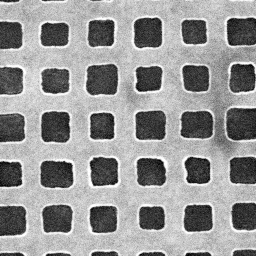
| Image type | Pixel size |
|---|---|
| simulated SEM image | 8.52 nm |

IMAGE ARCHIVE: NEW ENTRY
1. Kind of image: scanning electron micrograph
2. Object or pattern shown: a regular array of holes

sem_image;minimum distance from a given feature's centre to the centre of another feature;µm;0.391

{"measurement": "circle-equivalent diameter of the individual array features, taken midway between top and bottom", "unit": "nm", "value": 266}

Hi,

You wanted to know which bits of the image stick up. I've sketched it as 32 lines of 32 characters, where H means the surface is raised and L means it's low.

HHHHHHHHHHHHHHHHHHHHHHHHHHHHHHHH
HHHHHHHHHHHHHHHHHHHHHHHHHHHHHHHH
HHHHHHHHHHHHLLHHHLLLHHHLLHHHLLLL
LLLHHLLLLHHLLLHHHLLLHHHLLLHHLLLL
LLLHHLLLLHHLLLHHHLLLHHHLLLHHLLLL
LLLHHLLLHHHLLLHHHLLLHHHLLHHHHLLL
HHHHHHHHHHHHHHHHHHHHHHHHHHHHHHHH
HHHHHHHHHHHHHHHHHHHHHHHHHHHHHHHH
LLLHHHLHHHHLLLLHHLLLHHHLLLHHHLLL
LLLHHLLLLHHLLLLHHLLLHHHLLLHHHLLL
LLLHHLLLLHHLLLLHHLLLHHHLLLHHHLLL
LLLHHHLLHHHLLLLHHHHHHHHHLHHHHLLH
HHHHHHHHHHHHHHHHHHHHHHHHHHHHHHHH
HHHHHHHHHHHHHHHHHHHHHHHHHHHHHLLL
LLLHHLLLLHHLLLHHHLLLLHHLLLLHLLLL
LLLHHLLLLHHLLLHHHLLLLHHLLLLHLLLL
LLLHHLLLLHHLLLHHHLLLLHHLLLLHLLLL
LLLHHLLLLHHHLLHHHHLLHHHHHHHHHLLL
HHHHHHHHHHHHHHHHHHHHHHHHHHHHHHHH
HHHHHHHHHHHHHHHHHHHHHHHHHHHHHHHH
LLLHHLLLLHHLLLLHHLLLHHHLLLHHHLLL
LLLHHLLLLHHLLLLHHLLLLHHLLLHHHLLL
LLLHHLLLLHHLLLLHHLLLLHHLLLHHHLLL
HHHHHHLLHHHHHHHHHHHHHHHHHHHHHHHH
HHHHHHHHHHHHHHHHHHHHHHHHHHHHHHHH
HHHHHHHHHHHHHHHHHHHHHHHHLLHHHLLL
LLLHHLLLLHHLLLLHHLLLLHHLLLLHHLLL
LLLHHLLLLHHLLLLHHLLLLHHLLLLHHLLL
LLLHHLLLLHHLLLLHHHLLHHHLLLLHHLLL
LLHHHHHHHHHHHHHHHHHHHHHHHHHHHHHH
HHHHHHHHHHHHHHHHHHHHHHHHHHHHHHHH
HHHHHHHHHHHHLLHHHHLLHHHHHLHHHLLL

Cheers